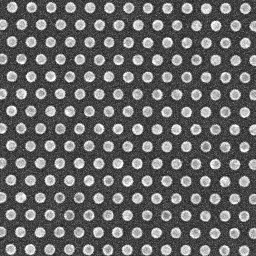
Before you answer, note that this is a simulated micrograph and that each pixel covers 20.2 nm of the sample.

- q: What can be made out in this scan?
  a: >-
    a regular array of raised bodies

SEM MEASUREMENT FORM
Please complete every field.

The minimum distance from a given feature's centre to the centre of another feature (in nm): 390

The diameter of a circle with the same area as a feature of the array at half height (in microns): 0.198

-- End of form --